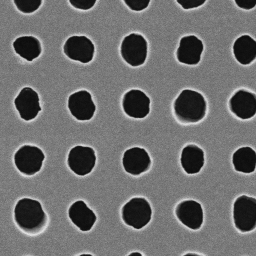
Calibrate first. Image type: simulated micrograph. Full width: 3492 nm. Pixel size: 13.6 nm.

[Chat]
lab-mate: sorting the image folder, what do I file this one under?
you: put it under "a regular array of holes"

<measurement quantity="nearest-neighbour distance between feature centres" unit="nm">725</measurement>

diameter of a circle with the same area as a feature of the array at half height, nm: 385